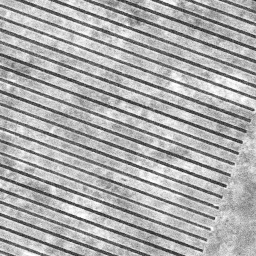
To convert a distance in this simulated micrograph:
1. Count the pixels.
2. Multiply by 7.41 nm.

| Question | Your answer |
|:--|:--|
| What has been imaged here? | parallel lines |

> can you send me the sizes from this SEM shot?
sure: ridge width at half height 61.8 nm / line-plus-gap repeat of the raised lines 0.0857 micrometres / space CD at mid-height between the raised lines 24.4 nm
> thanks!